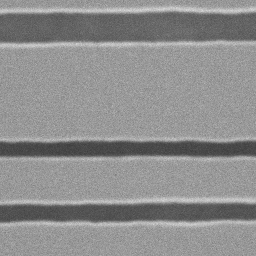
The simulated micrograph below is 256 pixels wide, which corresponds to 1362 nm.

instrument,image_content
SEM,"lines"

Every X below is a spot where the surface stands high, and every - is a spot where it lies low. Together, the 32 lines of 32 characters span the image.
XXXXXXXXXXXXXXXXXXXXXXXXXXXXXXXX
XXXXXX-------XX-XX-------XXXXXX-
--------------------------------
--------------------------------
--------------------------------
XX---XXXXXXXXXXXXXXXXXXXXXXXXXXX
XXXXXXXXXXXXXXXXXXXXXXXXXXXXXXXX
XXXXXXXXXXXXXXXXXXXXXXXXXXXXXXXX
XXXXXXXXXXXXXXXXXXXXXXXXXXXXXXXX
XXXXXXXXXXXXXXXXXXXXXXXXXXXXXXXX
XXXXXXXXXXXXXXXXXXXXXXXXXXXXXXXX
XXXXXXXXXXXXXXXXXXXXXXXXXXXXXXXX
XXXXXXXXXXXXXXXXXXXXXXXXXXXXXXXX
XXXXXXXXXXXXXXXXXXXXXXXXXXXXXXXX
XXXXXXXXXXXXXXXXXXXXXXXXXXXXXXXX
XXXXXXXXXXXXXXXXXXXXXXXXXXXXXXXX
XXXXXXXXXXXXXXXXXXXXXXXXXXXXXXXX
XXXXXXXXX----XX-XXXXXXX-XXXXXX--
--------------------------------
--------------------------------
XXXXXXXXXXXXXXXXXXXXXXXXXXXXXXXX
XXXXXXXXXXXXXXXXXXXXXXXXXXXXXXXX
XXXXXXXXXXXXXXXXXXXXXXXXXXXXXXXX
XXXXXXXXXXXXXXXXXXXXXXXXXXXXXXXX
XXXXXXXXXXXXXXXXXXXXXXXXXXXXXXXX
--------------------------------
--------------------------------
--------------------------------
XXXXXXXXXXXXXXXXXXXXXXXXXXXXXXXX
XXXXXXXXXXXXXXXXXXXXXXXXXXXXXXXX
XXXXXXXXXXXXXXXXXXXXXXXXXXXXXXXX
XXXXXXXXXXXXXXXXXXXXXXXXXXXXXXXX